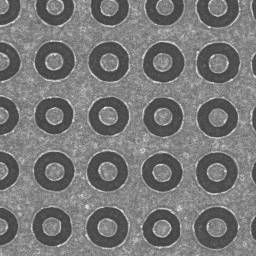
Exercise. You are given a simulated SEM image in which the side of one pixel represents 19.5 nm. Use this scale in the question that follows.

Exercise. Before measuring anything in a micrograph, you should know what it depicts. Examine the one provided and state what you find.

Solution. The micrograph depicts a regular array of ring-shaped grooves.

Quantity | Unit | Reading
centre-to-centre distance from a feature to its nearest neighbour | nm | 1060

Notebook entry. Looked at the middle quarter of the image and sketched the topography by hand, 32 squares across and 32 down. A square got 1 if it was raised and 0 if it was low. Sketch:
00011100011111001111001111100011
00111110001110001111000111000011
01111110000000011111000000000111
11111111000000111111100000001111
11111111111011111111111000111111
11111111111111111111111111111111
11111111111111111111111111111111
11111111111111111111111111111111
11111111110001111111111001111111
01111111000000011111110000001111
00111110000000001111100000000111
00111100011110001111000111000111
00111100011110001111000111100011
00111100011110001111000111100011
00111100001110001111000111100011
00111110000000001111000000000111
01111110000000011111100000000111
11111111100001111111110000011111
11111111111111111111111111111111
11111111111111111111111111111111
11111111111111111111111111111111
11111111111111111111111111111111
11111111000000111111111000111111
01111110000000011111100000001111
00111100000000011111000000000111
00011100011110001111000111000111
00011100011110001110001111100011
00011100011110001110001111100011
00111100001110001111000111000011
00111100000000011111000000000111
01111110000000111111100000001111
11111111100001111111110000011111